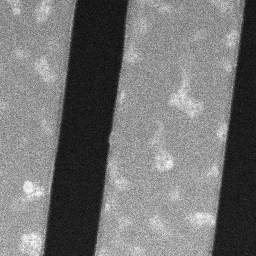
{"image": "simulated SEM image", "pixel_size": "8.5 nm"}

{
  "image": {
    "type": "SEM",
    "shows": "one or a few lines or trenches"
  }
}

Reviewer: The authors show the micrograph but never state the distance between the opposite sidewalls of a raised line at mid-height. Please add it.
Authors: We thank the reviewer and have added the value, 470 nm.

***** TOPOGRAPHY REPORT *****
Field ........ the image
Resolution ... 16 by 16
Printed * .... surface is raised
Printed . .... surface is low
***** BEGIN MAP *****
.....***.......*
....****.......*
....****.......*
....****.......*
....****.......*
....****......**
....***.......**
....***.......**
....***.......**
...****.......**
...****.......**
...****.......**
...****.......**
...***.......***
...***.......***
...***.......***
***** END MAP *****